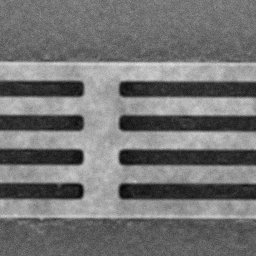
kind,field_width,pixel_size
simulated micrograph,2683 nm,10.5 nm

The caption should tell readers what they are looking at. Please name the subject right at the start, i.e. groups of lines, slits or small figures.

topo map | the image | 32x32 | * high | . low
................................
................................
................................
................................
................................
................................
................................
................................
********************************
********************************
..........*****.................
...........****.................
********************************
********************************
..........*****.................
...........****.................
*****************************...
********************************
********************************
...........****.................
..........*****.................
********************************
********************************
..........*****.................
..........*****.................
********************************
********************************
................................
................................
................................
................................
................................